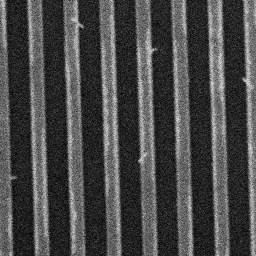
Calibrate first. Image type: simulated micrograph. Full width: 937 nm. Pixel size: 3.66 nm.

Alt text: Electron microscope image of parallel lines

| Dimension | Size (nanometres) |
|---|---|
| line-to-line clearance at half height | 84.7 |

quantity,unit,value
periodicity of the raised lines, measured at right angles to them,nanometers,132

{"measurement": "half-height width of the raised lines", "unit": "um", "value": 0.049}